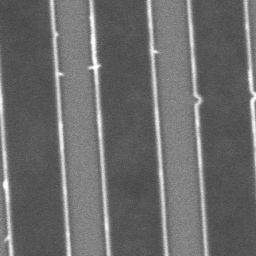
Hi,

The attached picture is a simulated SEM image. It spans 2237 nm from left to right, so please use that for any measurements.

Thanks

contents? one or a few lines or trenches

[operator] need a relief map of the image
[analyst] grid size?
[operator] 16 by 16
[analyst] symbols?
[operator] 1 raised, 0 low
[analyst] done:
1110001110001110
1110001110001111
1110001110001111
1111001111001111
1111001111001111
1111001111001111
1111001111001111
1111001111001111
1111001111001111
1111001111001111
1111001111001111
1111001111000111
1111000111000111
1111000111000111
0111000111000111
0111000111000111